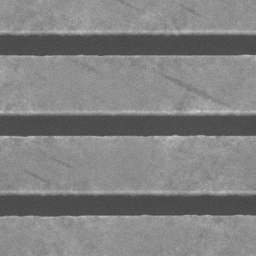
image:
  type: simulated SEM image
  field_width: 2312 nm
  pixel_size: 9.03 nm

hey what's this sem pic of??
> lines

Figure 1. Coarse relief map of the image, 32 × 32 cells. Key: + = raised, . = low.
++++++++++++++++++++++++++++++++
++++++++++++++++++++++++++++++++
++++++++++++++++++++++++++++++++
++++++++++++++++++++++++++++++++
................................
................................
................................
++++++++++++++++++++++++++++++++
++++++++++++++++++++++++++++++++
++++++++++++++++++++++++++++++++
++++++++++++++++++++++++++++++++
++++++++++++++++++++++++++++++++
++++++++++++++++++++++++++++++++
++++++++++++++++++++++++++++++++
................................
................................
................................
++++++++++++++++++++++++++++++++
++++++++++++++++++++++++++++++++
++++++++++++++++++++++++++++++++
++++++++++++++++++++++++++++++++
++++++++++++++++++++++++++++++++
++++++++++++++++++++++++++++++++
++++++++++++++++++++++++++++++++
................................
................................
................................
++++++++++++++++++++++++++++++++
++++++++++++++++++++++++++++++++
++++++++++++++++++++++++++++++++
++++++++++++++++++++++++++++++++
++++++++++++++++++++++++++++++++